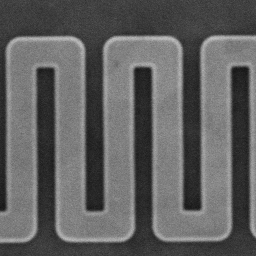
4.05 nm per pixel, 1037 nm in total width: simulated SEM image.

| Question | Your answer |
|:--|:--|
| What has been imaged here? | groups of lines, slits or small figures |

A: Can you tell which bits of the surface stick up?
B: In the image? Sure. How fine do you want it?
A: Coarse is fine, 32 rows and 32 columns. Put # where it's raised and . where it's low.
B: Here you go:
................................
................................
................................
................................
................................
.#########...#########...#######
.#########...##########..#######
.#########...##########..#######
.####..###...####..####..####..#
.###...###...####..####..####..#
.###...###...####..####..####..#
.###...###...####..####..####..#
.###...###...####..####..####..#
.###...###...####..####..####..#
.###...###...####..####..####..#
.###...###...####..####..####..#
.###...###...####..####..####..#
.###...###...####..####..####..#
.###...###...####..####..####..#
.###...###...####..####..####..#
.###...###...####..####..####..#
.###...####..####..####..####..#
.###...####..####..####..####..#
.###...####..####..####..####..#
.###...####..####..####..####..#
.###...####..####..####..####..#
####...####.#####..##########..#
####...##########..##########..#
####...##########..##########..#
####....########....########....
................................
................................